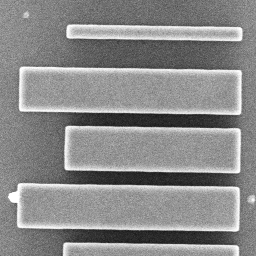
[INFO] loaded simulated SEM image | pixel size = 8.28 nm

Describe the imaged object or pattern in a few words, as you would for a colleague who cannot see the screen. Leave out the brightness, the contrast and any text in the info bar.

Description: groups of lines, slits or small figures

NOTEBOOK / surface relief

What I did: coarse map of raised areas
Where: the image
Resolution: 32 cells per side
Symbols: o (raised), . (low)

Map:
................................
................................
................................
........oooooooooooooooooooooo..
.........ooooooooooooooooooooo..
................................
................................
................................
...oo...........................
...ooooooooooooooooooooooooooo..
...ooooooooooooooooooooooooooo..
...ooooooooooooooooooooooooooo..
...ooooooooooooooooooooooooooo..
...ooooooooooooooooooooooooooo..
................................
................................
........oooooooooooooooooooooo..
........oooooooooooooooooooooo..
........oooooooooooooooooooooo..
........oooooooooooooooooooooo..
........oooooooooooooooooooooo..
..........................oooo..
................................
..oooooooooooooooooooooooooooo..
.ooooooooooooooooooooooooooooo..
..oooooooooooooooooooooooooooo..
..oooooooooooooooooooooooooooo..
..oooooooooooooooooooooooooooo..
....oooooooooooooooooooooooooo..
................................
........ooooo...................
........oooooooooooooooooooooo..